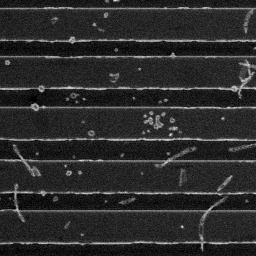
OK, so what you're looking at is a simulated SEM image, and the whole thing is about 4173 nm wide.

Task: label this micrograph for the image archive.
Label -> lines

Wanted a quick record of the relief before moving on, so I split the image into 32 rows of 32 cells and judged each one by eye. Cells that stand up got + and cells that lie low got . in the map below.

................................
++++++++++++++++++++++++++++++++
++++++++++++++++++++++++++++++++
++++++++++++++++++++++++++++++++
++++++++++++++++++++++++++++++++
................................
................................
++++++++++++++++++++++++++++++++
++++++++++++++++++++++++++++++++
++++++++++++++++++++++++++++++++
++++++++++++++++++++++++++++++++
................................
................................
++++++++++++++++++++++++++++++++
++++++++++++++++++++++++++++++++
++++++++++++++++++++++++++++++++
++++++++++++++++++++++++++++++++
................................
................................
................................
++++++++++++++++++++++++++++++++
++++++++++++++++++++++++++++++++
++++++++++++++++++++++++++++++++
++++++++++++++++++++++++++++++++
................................
................................
++++++++++++++++++++++++++++++++
++++++++++++++++++++++++++++++++
++++++++++++++++++++++++++++++++
++++++++++++++++++++++++++++++++
................................
................................